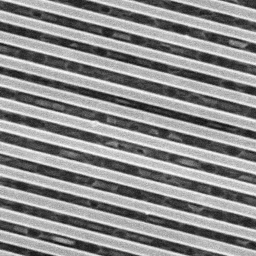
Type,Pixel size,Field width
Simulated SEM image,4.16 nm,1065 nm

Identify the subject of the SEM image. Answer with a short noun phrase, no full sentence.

parallel lines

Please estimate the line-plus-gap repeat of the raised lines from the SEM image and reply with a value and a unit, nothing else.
88.5 nm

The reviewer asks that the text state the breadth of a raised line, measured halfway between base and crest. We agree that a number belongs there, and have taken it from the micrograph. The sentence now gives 43.3 nm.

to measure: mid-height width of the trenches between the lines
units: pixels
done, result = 10.4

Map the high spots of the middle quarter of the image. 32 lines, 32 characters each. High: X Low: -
--------XXXXXXXXXX----------XXXX
------------XXXXXXXXXX---------X
XXX------------XXXXXXXXXXX------
XXXXXXX------------XXXXXXXXXXX--
XXXXXXXXXXX------------XXXXXXXXX
---XXXXXXXXXXXX------------XXXXX
-------XXXXXXXXXXX-------------X
XX---------XXXXXXXXXXX----------
XXXXXX---------XXXXXXXXXXX------
XXXXXXXXXX---------XXXXXXXXXXX--
----XXXXXXXXXX---------XXXXXXXXX
--------XXXXXXXXXX---------XXXXX
------------XXXXXXXXXX---------X
XXXX------------XXXXXXXXXX------
XXXXXXXX------------XXXXXXXXXX--
-XXXXXXXXXXX-----------XXXXXXXXX
-----XXXXXXXXXXX-----------XXXXX
---------XXXXXXXXXXX-----------X
XX----------XXXXXXXXXXXX--------
XXXXXX----------XXXXXXXXXXXX----
XXXXXXXXXX----------XXXXXXXXXXX-
---XXXXXXXXXXX----------XXXXXXXX
-------XXXXXXXXXX-----------XXXX
-----------XXXXXXXXXX-----------
XXX------------XXXXXXXXXX-------
XXXXXXX------------XXXXXXXXXX---
-XXXXXXXXXX------------XXXXXXXXX
-----XXXXXXXXXX------------XXXXX
---------XXXXXXXXXX------------X
-------------XXXXXXXXXX---------
XXXX-------------XXXXXXXXXX-----
XXXXXXXX-------------XXXXXXXXXX-